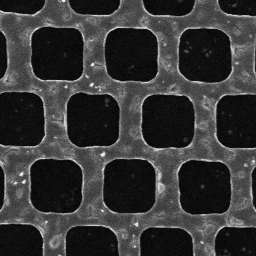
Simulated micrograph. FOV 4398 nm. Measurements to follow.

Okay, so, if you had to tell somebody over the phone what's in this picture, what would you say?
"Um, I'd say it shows a regular array of holes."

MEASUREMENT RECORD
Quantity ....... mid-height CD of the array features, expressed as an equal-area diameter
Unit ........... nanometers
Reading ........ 991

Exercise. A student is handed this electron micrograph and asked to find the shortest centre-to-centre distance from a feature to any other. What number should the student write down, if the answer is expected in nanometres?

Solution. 1270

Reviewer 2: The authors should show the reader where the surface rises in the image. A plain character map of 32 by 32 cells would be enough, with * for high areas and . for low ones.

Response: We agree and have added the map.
......***......***......***.....
*....****.....*****.....****....
********************************
*****....******..***************
.***......***......****.....****
.***......***.......**.......***
.***......***.......**.......***
.***......***.......**.......***
.***......***.......**.......***
*****.....****.....****......***
********************************
*..*****************************
.....****......***......***.....
.....***.......***......***.....
......**.......***......***.....
......**.......***......***.....
......**.......***......***.....
.....****......***......***.....
**********************.******..*
********************************
****......***......****.....****
****......***......***.......***
.***......***.......**.......**.
.***......***.......**.......**.
****......***......***.......***
****......***......****......***
*****....*****....*****.....****
********************************
.....****.....*****...******....
.....***......****......***.....
.....***.......**.......***.....
.....***.......***......***.....